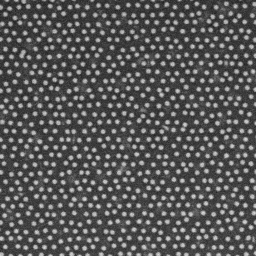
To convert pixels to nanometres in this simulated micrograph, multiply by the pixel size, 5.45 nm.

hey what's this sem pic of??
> a regular array of raised bodies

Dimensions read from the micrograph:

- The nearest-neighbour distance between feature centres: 43.8 nm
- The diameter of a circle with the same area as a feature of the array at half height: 23.8 nanometres